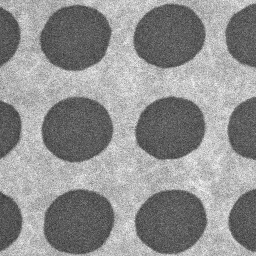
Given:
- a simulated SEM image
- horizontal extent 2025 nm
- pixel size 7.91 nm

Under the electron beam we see holes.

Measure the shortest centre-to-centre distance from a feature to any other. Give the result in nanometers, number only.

730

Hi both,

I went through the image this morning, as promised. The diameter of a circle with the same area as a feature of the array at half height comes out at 68.1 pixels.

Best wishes